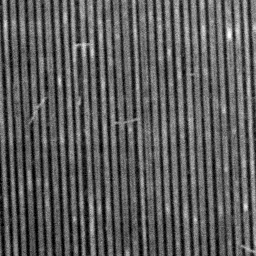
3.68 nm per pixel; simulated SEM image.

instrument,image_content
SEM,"parallel lines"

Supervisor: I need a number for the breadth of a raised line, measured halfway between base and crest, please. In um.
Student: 0.0179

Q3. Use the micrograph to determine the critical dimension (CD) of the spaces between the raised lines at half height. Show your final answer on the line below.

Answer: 13.8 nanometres